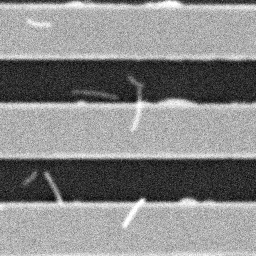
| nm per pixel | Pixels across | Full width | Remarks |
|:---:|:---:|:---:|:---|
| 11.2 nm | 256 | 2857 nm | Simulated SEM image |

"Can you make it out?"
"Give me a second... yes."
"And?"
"lines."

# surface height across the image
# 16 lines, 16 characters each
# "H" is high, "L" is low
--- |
HHHHHHHHHHHHHHHH
HHHHHHHHHHHHHHHH
HHHHHHHHHHHHHHHH
HHHHHHHHHHHHHHHH
LLLLLLLLLLLLLLLL
LLLLLLLLLLLLLLLL
HHHHHHHHHHHLLLLL
HHHHHHHHHHHHHHHH
HHHHHHHHHHHHHHHH
HHHHHHHHHHHHHHHH
LLLLLLLLLLLLLLLL
LLLLLLLLLLLLLLLL
LLLLLLLLLLLLLLLL
HHHHHHHHHHHHHHHH
HHHHHHHHHHHHHHHH
HHHHHHHHHHHHHHHH